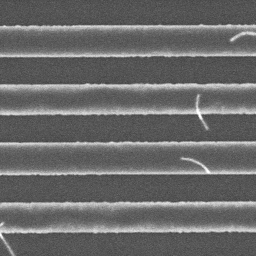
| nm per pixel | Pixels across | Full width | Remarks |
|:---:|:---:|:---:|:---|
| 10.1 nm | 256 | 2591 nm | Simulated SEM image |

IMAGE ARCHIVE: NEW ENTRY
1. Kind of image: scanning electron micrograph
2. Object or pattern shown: lines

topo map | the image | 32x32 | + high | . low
................................
................................
................................
++++++++++++++++++++++++++++++++
++++++++++++++++++++++++++++++++
++++++++++++++++++++++++++++++++
++++++++++++++++++++++++++++++++
................................
................................
................................
................................
++++++++++++++++++++++++++++++++
++++++++++++++++++++++++++++++++
++++++++++++++++++++++++++++++++
................................
................................
................................
................................
++++++++++++++++++++++++++++++++
++++++++++++++++++++++++++++++++
++++++++++++++++++++++++++++++++
++++++++++++++++++++++++++++++++
................................
................................
................................
........++.....+++++++++++++++++
++++++++++++++++++++++++++++++++
++++++++++++++++++++++++++++++++
++++++++++++++++++++++++++++++++
................................
................................
................................